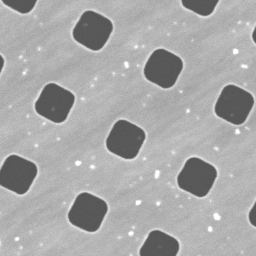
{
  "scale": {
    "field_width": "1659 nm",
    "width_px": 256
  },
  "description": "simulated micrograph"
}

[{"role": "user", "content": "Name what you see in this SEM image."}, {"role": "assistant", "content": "holes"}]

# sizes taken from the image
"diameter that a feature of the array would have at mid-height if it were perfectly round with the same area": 245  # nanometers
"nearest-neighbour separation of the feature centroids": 516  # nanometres